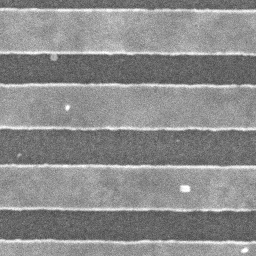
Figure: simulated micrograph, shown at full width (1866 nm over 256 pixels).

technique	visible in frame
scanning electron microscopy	lines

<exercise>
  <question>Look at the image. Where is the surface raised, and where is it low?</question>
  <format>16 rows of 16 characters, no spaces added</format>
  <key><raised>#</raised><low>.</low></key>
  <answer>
................
################
################
................
................
################
################
################
................
................
################
################
################
................
................
################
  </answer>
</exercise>